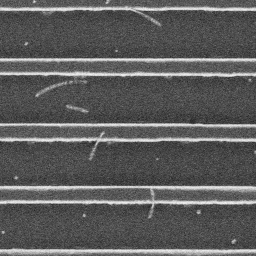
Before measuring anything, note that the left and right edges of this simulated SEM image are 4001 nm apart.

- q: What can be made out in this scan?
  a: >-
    lines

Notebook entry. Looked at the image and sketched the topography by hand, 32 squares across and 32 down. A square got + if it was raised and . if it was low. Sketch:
++++++++++++++++++++++++++++++++
................................
................................
................................
................................
................................
................................
+++++++++++++++++++.+++++++.++++
++++++++++++++++++++++++++++++++
................................
................................
................................
................................
................................
................................
................................
++++++++++++++++++++++++++++++++
++++++++++++++++++++++++++++++++
................................
................................
................................
................................
................................
+++++++++++++++++++++++++++++++.
++++++++++++++++++++++++++++++++
................................
................................
................................
................................
................................
................................
++++++++++++++++++++++++++++++++